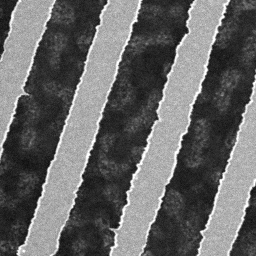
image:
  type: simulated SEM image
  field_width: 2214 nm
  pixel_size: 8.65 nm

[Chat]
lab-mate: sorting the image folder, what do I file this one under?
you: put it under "one or a few lines or trenches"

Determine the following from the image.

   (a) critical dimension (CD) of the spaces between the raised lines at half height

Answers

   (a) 51.7 px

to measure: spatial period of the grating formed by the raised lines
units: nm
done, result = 720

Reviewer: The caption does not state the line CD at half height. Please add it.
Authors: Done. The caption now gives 272 nanometres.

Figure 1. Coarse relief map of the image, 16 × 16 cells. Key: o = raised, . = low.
.oo....oo...oo..
.oo...oo....oo..
oo....oo...oo...
oo....oo...oo...
oo...oo....oo...
o....oo...ooo...
o....oo...oo....
o...oo....oo...o
....oo...oo....o
....oo...oo....o
...oo....oo...oo
...oo...oo....oo
...oo...oo...oo.
..oo....oo...oo.
..oo...oo....oo.
.ooo...oo...oo..